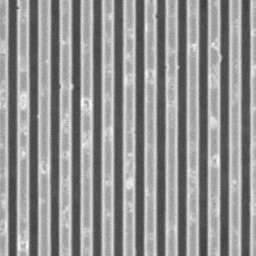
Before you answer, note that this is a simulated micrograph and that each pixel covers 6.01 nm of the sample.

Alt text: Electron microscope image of parallel lines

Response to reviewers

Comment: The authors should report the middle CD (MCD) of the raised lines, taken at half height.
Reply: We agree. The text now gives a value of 72.1 nm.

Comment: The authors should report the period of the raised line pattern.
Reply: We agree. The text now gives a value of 127 nanometres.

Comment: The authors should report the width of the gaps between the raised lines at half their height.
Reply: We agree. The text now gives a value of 55.6 nm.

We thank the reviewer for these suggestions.